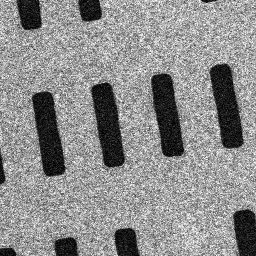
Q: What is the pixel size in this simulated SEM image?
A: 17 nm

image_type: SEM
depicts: holes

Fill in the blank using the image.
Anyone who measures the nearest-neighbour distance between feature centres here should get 1020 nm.